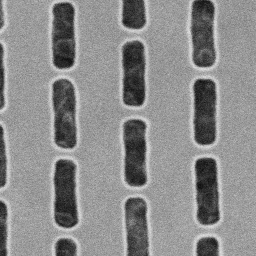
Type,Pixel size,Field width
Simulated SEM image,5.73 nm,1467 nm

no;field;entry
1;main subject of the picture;holes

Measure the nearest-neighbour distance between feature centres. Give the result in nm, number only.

453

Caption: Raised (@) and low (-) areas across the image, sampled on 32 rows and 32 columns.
@@@@@@@--@@@@@@---@@@@@@---@@@@@
@@@@@@@--@@@@@@---@@@@@@---@@@@@
-@@@@@@--@@@@@@---@@@@@@---@@@@@
@@@@@@@--@@@@@@@--@@@@@@---@@@@@
@@@@@@---@@@@@@@@@@@@@@@---@@@@@
@@@@@@---@@@@@@@--@@@@@@---@@@@@
-@@@@@---@@@@@@---@@@@@@---@@@@@
-@@@@@@--@@@@@@---@@@@@@---@@@@@
-@@@@@@--@@@@@@---@@@@@@@@@@@@@@
-@@@@@@@@@@@@@@---@@@@@@@@@@@@@@
-@@@@@@--@@@@@@---@@@@@@---@@@@@
@@@@@@----@@@@@---@@@@@@---@@@@@
@@@@@@----@@@@@---@@@@@@---@@@@@
@@@@@@@---@@@@@@@@@@@@@@---@@@@@
@@@@@@@--@@@@@@@@@@@@@@@---@@@@@
@@@@@@@--@@@@@@@--@@@@@@---@@@@@
@@@@@@@---@@@@@---@@@@@@---@@@@@
-@@@@@@---@@@@@---@@@@@@---@@@@@
-@@@@@@@-@@@@@@@--@@@@@@@@@@@@@@
-@@@@@@@@@@@@@@@--@@@@@@@@@@@@@@
-@@@@@@--@@@@@@---@@@@@@---@@@@@
-@@@@@@---@@@@@---@@@@@@---@@@@@
-@@@@@@---@@@@@@--@@@@@@---@@@@@
@@@@@@@---@@@@@@@@@@@@@@---@@@@@
@@@@@@@---@@@@@@@@@@@@@@---@@@@@
-@@@@@@---@@@@@@--@@@@@@---@@@@@
-@@@@@@---@@@@@@--@@@@@@@--@@@@@
-@@@@@@---@@@@@---@@@@@@@--@@@@@
-@@@@@@@-@@@@@@@--@@@@@@@@@@@@@@
-@@@@@@@@@@@@@@@---@@@@@@@@@@@@@
-@@@@@@--@@@@@@@---@@@@@@--@@@@@
-@@@@@@---@@@@@@---@@@@@---@@@@@